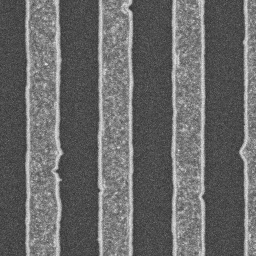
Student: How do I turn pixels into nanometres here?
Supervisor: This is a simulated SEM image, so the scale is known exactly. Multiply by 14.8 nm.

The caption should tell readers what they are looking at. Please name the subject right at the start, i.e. one or a few lines or trenches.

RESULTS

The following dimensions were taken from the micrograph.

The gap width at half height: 629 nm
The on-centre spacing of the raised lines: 1080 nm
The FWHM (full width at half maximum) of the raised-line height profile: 450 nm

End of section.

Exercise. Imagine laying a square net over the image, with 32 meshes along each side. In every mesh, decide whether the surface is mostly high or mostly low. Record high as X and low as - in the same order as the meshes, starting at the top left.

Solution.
----XXX------XXX------XXX------X
----XXX------XXX------XXX------X
---XXXX------XXX------XXX------X
---XXXX------XXX------XXX------X
---XXXX------XXX------XXX------X
---XXXX------XXX------XXX------X
---XXXX------XXX------XXX------X
----XXX------XXX------XXX------X
----XXX------XXX------XXX------X
----XXX------XXX------XXX------X
----XXX------XXX------XXX------X
---XXXX------XXX------XXX------X
---XXXX------XXX------XXX------X
---XXXX------XXX------XXX------X
---XXXX------XXX------XXX------X
----XXX------XXX------XXX------X
----XXX-----XXXX------XXX------X
----XXX-----XXXX------XXX------X
----XXX-----XXXX------XXX-----XX
---XXXX-----XXXX------XXX-----XX
---XXXX-----XXXX------XXX------X
---XXXX------XXX------XXX------X
---XXXX------XXX------XXX------X
----XXX------XXX------XXX------X
---XXXX------XXX------XXX------X
---XXXX------XXX------XXX------X
---XXXX------XXX------XXX------X
---XXXX------XXX------XXX------X
---XXXX------XXX------XXX------X
---XXXX-----XXXX------XXX------X
---XXXX------XXX------XXX------X
---XXXX------XXX------XXX------X